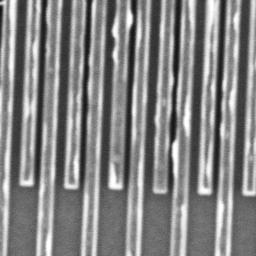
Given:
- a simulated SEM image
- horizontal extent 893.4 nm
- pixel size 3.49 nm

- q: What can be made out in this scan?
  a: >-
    parallel lines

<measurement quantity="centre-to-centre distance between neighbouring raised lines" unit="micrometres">0.0773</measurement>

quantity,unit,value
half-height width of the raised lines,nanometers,44.9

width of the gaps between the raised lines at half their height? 37.9 nm